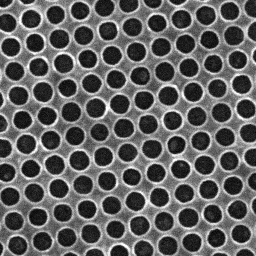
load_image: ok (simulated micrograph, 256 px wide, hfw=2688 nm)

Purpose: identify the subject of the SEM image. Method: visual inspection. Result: a regular array of holes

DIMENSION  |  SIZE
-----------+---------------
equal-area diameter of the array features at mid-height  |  204 nanometres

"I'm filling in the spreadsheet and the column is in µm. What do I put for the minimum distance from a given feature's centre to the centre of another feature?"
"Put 0.256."